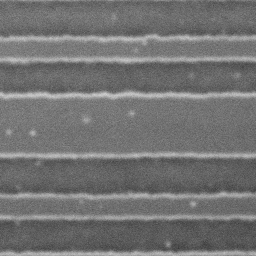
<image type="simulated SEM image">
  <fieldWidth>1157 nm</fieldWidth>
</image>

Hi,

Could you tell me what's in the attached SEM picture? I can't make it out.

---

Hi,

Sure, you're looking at lines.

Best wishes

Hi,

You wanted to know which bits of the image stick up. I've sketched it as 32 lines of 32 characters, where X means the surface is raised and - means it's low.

--------------------------------
--------------------------------
--------------------------------
--------------------------------
--------------------------------
XXXXXXXXXXXXXXXXXXXXXXXXXXXXXXXX
XXXXXXXXXXXXXXXXXXXXXXXXXXXXXXXX
XXXXXXXXXXXXXXXXXXX-XXXXX-------
--------------------------------
--------------------------------
--------------------------------
--------------------------------
XXXXXXXXXXXXXXXXXXXXXXXXXXXXXXXX
XXXXXXXXXXXXXXXXXXXXXXXXXXXXXXXX
XXXXXXXXXXXXXXXXXXXXXXXXXXXXXXXX
XXXXXXXXXXXXXXXXXXXXXXXXXXXXXXXX
XXXXXXXXXXXXXXXXXXXXXXXXXXXXXXXX
XXXXXXXXXXXXXXXXXXXXXXXXXXXXXXXX
XXXXXXXXXXXXXXXXXXXXXXXXXXXXXXXX
XXXXXXXXXXXXXXXXXXXX-XX-XXXXXXXX
--------------------------------
--------------------------------
--------------------------------
--------------------------------
X-XXXXXXXXX---X-XXXXXXXXXXXXXXXX
XXXXXXXXXXXXXXXXXXXXXXXXXXXXXXXX
XXXXXXXXXXXXXXXXXXXXXXXXXXXXXXXX
--------------------------------
--------------------------------
--------------------------------
--------------------------------
--------------------------------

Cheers